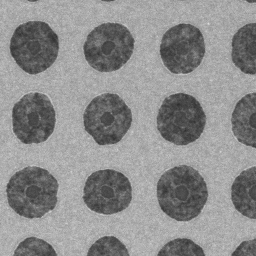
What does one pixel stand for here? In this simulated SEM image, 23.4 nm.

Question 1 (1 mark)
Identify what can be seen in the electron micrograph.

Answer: a regular array of ring-shaped grooves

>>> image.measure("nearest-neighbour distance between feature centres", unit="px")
72